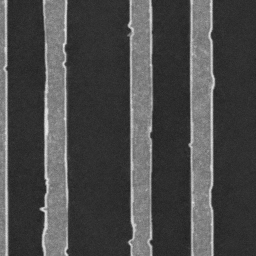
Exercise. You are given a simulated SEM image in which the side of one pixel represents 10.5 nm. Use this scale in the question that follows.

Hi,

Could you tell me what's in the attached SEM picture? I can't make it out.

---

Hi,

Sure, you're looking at one or a few lines or trenches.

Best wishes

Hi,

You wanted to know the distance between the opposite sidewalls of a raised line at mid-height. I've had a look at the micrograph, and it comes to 0.211 microns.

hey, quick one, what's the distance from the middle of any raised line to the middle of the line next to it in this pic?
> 764 nanometres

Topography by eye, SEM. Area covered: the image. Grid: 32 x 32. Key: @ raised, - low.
@-----@@--------@@@-----@@------
@-----@@--------@@@-----@@------
@-----@@--------@@@-----@@------
@-----@@--------@@@-----@@------
@-----@@--------@@@-----@@------
@-----@@--------@@@-----@@------
@-----@@--------@@@-----@@------
@-----@@--------@@@-----@@------
@-----@@--------@@@-----@@------
@-----@@--------@@@-----@@@-----
@-----@@--------@@@-----@@@-----
@-----@@--------@@@-----@@------
@-----@@--------@@@-----@@------
@-----@@--------@@@-----@@------
@-----@@--------@@@-----@@------
@-----@@--------@@@-----@@------
@-----@@--------@@@-----@@------
@-----@@--------@@@-----@@------
@-----@@--------@@@-----@@------
@-----@@--------@@@-----@@------
@-----@@--------@@@-----@@------
@-----@@--------@@@-----@@@-----
@-----@@--------@@@-----@@@-----
@-----@@--------@@@-----@@------
@-----@@--------@@@-----@@------
@-----@@--------@@@-----@@------
@-----@@--------@@@-----@@@-----
@-----@@--------@@@-----@@@-----
@-----@@---------@@-----@@@-----
@----@@@---------@@-----@@@-----
@----@@@--------@@@-----@@@-----
@-----@@---------@@-----@@@-----